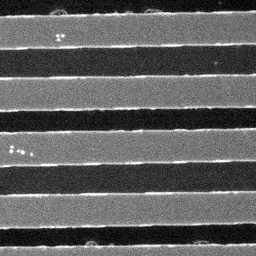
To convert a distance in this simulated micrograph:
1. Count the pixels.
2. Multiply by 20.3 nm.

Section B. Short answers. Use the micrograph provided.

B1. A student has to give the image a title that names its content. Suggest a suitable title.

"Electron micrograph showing lines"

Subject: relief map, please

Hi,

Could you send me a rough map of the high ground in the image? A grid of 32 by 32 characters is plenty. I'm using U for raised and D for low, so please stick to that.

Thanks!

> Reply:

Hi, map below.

DDDDDDDDDDDDDDDDDDDDDDDDDDDDDDDD
DDDDDDDDDDDDDDDDDDDDDDDDDDDDDDDU
UUUUUUUUUUUUUUUUUUUUUUUUUUUUUUUU
UUUUUUUUUUUUUUUUUUUUUUUUUUUUUUUU
UUUUUUUUUUUUUUUUUUUUUUUUUUUUUUUU
UUUUUUUUUUUUUUUUUUUUUUUUUUUUUDDD
DDDDDDDDDDDDDDDDDDDDDDDDDDDDDDDD
DDDDDDDDDDDDDDDDDDDDDDDDDDDDDDDD
DDDDDDDDDDDDDDDDDDDDDDDDDDDDDDDD
DDDDDDDDDDDDDDDDDDDDDDDDDUUUUUUU
UUUUUUUUUUUUUUUUUUUUUUUUUUUUUUUU
UUUUUUUUUUUUUUUUUUUUUUUUUUUUUUUU
UUUUUUUUUUUUUUUUUUUUUUUUUUUUUUUU
UUUUUUUUUUUUUUUUUUUUUUUUUDUDDDDD
DDDDDDDDDDDDDDDDDDDDDDDDDDDDDDDD
DDDDDDDDDDDDDDDDDDDDDDDDDDDDDDDD
DDDDDDUUUUUUUUUUUUUUUUUUUUUUUUUU
UUUUUUUUUUUUUUUUUUUUUUUUUUUUUUUU
UUUUUUUUUUUUUUUUUUUUUUUUUUUUUUUU
UUUUUUUUUUUUUUUUUUUUUUUUUUUUUUUU
UUUUUUUUUUUUUDDDDDDDDDDDDDDDDDDD
DDDDDDDDDDDDDDDDDDDDDDDDDDDDDDDD
DDDDDDDDDDDDDDDDDDDDDDDDDDDDDDDD
DDDDDDDDDDDDDDDDDDDDDDDDDDDDDDDD
DUUUUUUUUUUUUUUUUUUUUUUUUUUUUUUU
UUUUUUUUUUUUUUUUUUUUUUUUUUUUUUUU
UUUUUUUUUUUUUUUUUUUUUUUUUUUUUUUU
UUUUUUUUUUUUUUUUUUUUUUUUUUUUUUUU
UDDDDDDDDDDDDDDDDDDDDDDDDDDDDDDD
DDDDDDDDDDDDDDDDDDDDDDDDDDDDDDDD
DDDDDDDDDDDDDDDDDDDDDDDDDDDDDDDD
UUUUUUUUUUUUUUUUUUUUUUUUUUUUUUUU